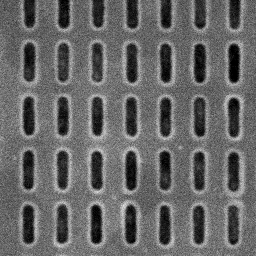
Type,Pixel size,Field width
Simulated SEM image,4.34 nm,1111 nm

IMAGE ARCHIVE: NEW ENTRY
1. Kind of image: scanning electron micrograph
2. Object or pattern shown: a regular array of holes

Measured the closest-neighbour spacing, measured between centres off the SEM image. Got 0.147 microns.